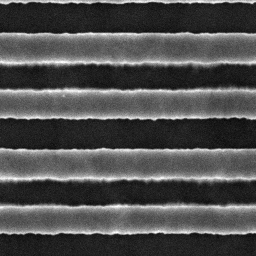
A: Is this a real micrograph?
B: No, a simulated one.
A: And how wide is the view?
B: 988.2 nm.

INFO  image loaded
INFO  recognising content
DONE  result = lines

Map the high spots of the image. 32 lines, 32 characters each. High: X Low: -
--------------------------------
--------------------------------
--------------------------------
--------------------------------
XXXXXXXXXXXXXXXXXXXXXXXXXXXXXXXX
XXXXXXXXXXXXXXXXXXXXXXXXXXXXXXXX
XXXXXXXXXXXXXXXXXXXXXXXXXXXXXXXX
XXXXXXXXXXXXXXXXXXXXXXXXXXXXXXXX
--------------------------------
--------------------------------
--------------------------------
XXXXXXXXXXXXXXXXXXXXXXXXXXXXXXXX
XXXXXXXXXXXXXXXXXXXXXXXXXXXXXXXX
XXXXXXXXXXXXXXXXXXXXXXXXXXXXXXXX
XXXXXXXXXXXXXXXXXXXXXXXXXXXXXXXX
--------------------------------
--------------------------------
--------------------------------
--------------------------------
XXXXXXXXXXXXXXXXXXXXXXXXXXXXXXXX
XXXXXXXXXXXXXXXXXXXXXXXXXXXXXXXX
XXXXXXXXXXXXXXXXXXXXXXXXXXXXXXXX
--------------------------------
--------------------------------
--------------------------------
--------------------------------
XXXXXXXXXXXXXXXXXXXXXXXXXXXXXXXX
XXXXXXXXXXXXXXXXXXXXXXXXXXXXXXXX
XXXXXXXXXXXXXXXXXXXXXXXXXXXXXXXX
--------------------------------
--------------------------------
--------------------------------